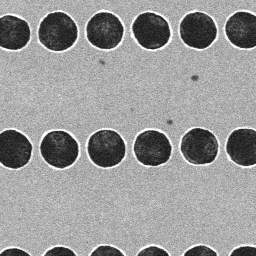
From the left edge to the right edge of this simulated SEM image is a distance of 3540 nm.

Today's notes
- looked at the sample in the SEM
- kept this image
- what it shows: a regular array of holes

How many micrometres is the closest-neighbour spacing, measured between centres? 0.643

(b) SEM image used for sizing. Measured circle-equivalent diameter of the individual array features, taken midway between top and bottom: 527 nanometres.